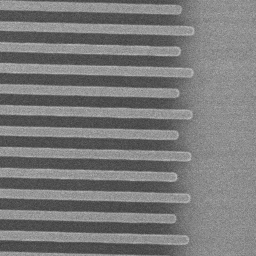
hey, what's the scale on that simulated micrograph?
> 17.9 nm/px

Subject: groups of lines, slits or small figures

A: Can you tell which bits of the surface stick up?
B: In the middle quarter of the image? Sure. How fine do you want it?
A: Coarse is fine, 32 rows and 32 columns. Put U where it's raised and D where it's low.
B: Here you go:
UUUUUDDDDDDDDDDDDDDDDDDDDDDDDDDD
UUUUUUUUUUUUUUUUUUUUUUUUUUUUUUUU
DDDDUUUUUUUUUUUUUUUUUUUUUUUUUUUU
DDDDDDDDDDDDDDDDDDDDDDDDDDDDDDDD
DDDDDDDDDDDDDDDDDDDDDDDDDDDDDDDD
DDDDDDDDDDDDDDDDDDDDDDDDDDDDDDDD
UUUUUUUUUUUUUUUUUUUUUUUUUUUUDDDD
UUUUUUUUUUUUUUUUUUUUUUUUUUUUUDDD
DDDDDDDDDDDDDDDDDDDDDDDDDDDDDDDD
DDDDDDDDDDDDDDDDDDDDDDDDDDDDDDDD
DDDDDDDDDDDDDDDDDDDDDDDDDDDDDDDD
UUUUUUUUUUUUUUUUUUUUUUUUDDDDDDDD
UUUUUUUUUUUUUUUUUUUUUUUUUUUUUUUU
DDDDDDDDDDDDDDDDDDDDDDUUUUUUUUUU
DDDDDDDDDDDDDDDDDDDDDDDDDDDDDDDD
DDDDDDDDDDDDDDDDDDDDDDDDDDDDDDDD
UUUUUUUUUUUUUUUDDDDDDDDDDDDDDDDD
UUUUUUUUUUUUUUUUUUUUUUUUUUUUDDDD
DDDDDDDDDDDDDDUUUUUUUUUUUUUUDDDD
DDDDDDDDDDDDDDDDDDDDDDDDDDDDDDDD
DDDDDDDDDDDDDDDDDDDDDDDDDDDDDDDD
UUUUUDDDDDDDDDDDDDDDDDDDDDDDDDDD
UUUUUUUUUUUUUUUUUUUUUUUUUUUUUUUU
DDDDDDDUUUUUUUUUUUUUUUUUUUUUUUUU
DDDDDDDDDDDDDDDDDDDDDDDDDDDDDDDD
DDDDDDDDDDDDDDDDDDDDDDDDDDDDDDDD
DDDDDDDDDDDDDDDDDDDDDDDDDDDDDDDD
UUUUUUUUUUUUUUUUUUUUUUUUUUUUDDDD
UUUUUUUUUUUUUUUUUUUUUUUUUUUUDDDD
DDDDDDDDDDDDDDDDDDDDDDDDDDDDDDDD
DDDDDDDDDDDDDDDDDDDDDDDDDDDDDDDD
DDDDDDDDDDDDDDDDDDDDDDDDDDDDDDDD